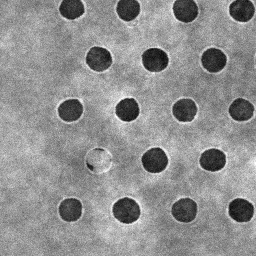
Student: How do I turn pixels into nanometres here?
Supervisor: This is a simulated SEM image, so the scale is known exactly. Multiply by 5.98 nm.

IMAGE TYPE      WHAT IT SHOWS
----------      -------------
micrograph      a regular array of holes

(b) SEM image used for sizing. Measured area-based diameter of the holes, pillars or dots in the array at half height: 158 nm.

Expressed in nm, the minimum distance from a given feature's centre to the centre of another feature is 339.